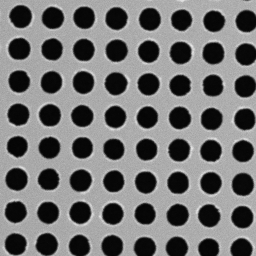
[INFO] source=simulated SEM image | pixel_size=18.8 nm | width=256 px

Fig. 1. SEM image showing a regular array of holes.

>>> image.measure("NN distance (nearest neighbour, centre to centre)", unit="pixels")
31.9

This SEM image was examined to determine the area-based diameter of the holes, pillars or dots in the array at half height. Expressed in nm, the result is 424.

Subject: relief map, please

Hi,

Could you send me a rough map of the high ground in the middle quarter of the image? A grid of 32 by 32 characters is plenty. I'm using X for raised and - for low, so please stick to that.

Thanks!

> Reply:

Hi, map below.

XXXXXXXXXXXXXXXXXXXXXXXXXXXXXXXX
XXXXXXXXXXXXXXXXXXXXXXXXXXXXXXXX
XXX----XXXX----XXXXX---XXXXXXXXX
XX-----XXX-----XXXX----XXXX----X
XX------XX------XX------XX------
XX-----XXX------XX------XX------
XXX----XXXX-----XXX-----XXX-----
XXXX-XXXXXXX--XXXXXX--XXXXX----X
XXXXXXXXXXXXXXXXXXXXXXXXXXXXXXXX
XXXXXXXXXXXXXXXXXXXXXXXXXXXXXXXX
XXXX-XXXXXXX--XXXXXXXXXXXXXXXXXX
XX-----XXXX----XXXX----XXXX----X
XX-----XXX------XX-----XXX-----X
XX------XX------XX------XX------
XX-----XXX-----XXX-----XXX------
XXX---XXXXX----XXXX----XXXX----X
XXXXXXXXXXXXXXXXXXXXXXXXXXXXXXXX
XXXXXXXXXXXXXXXXXXXXXXXXXXXXXXXX
XXX---XXXXXXXXXXXXXX-XXXXXXXXXXX
XX-----XXX-----XXXX----XXXX----X
XX-----XXX-----XXX-----XXX------
XX-----XXX-----XXX-----XXX------
XX-----XXX-----XXX-----XXX-----X
XXX---XXXXX---XXXXX----XXXX----X
XXXXXXXXXXXXXXXXXXXXXXXXXXXX-XXX
XXXXXXXXXXXXXXXXXXXXXXXXXXXXXXXX
XXX--XXXXXXXXXXXXXXXXXXXXXXXXXXX
XX-----XXX-----XXXX---XXXXX---XX
XX-----XXX-----XXX-----XXX-----X
X------XXX-----XXX-----XXX-----X
XX-----XXX-----XXX-----XXX-----X
XXX---XXXXX---XXXX-----XXX-----X